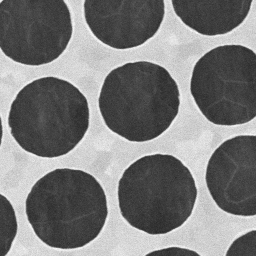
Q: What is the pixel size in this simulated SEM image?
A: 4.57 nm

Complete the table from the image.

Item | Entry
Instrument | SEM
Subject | holes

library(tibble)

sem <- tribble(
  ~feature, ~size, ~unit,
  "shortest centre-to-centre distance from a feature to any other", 417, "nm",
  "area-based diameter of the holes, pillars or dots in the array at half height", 0.369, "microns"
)